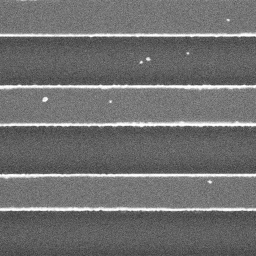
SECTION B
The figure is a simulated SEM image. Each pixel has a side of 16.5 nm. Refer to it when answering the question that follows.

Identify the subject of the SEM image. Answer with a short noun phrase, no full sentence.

lines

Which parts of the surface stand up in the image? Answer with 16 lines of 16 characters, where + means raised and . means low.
++++++++++++++++
++++++++++++++++
................
................
................
++++++++++++++++
++++++++++++++++
++++++++++++++++
................
................
................
++++++++++++++++
++++++++++++++++
................
................
................